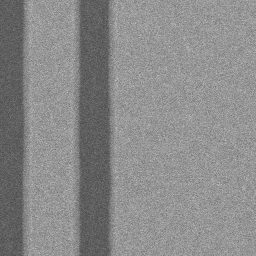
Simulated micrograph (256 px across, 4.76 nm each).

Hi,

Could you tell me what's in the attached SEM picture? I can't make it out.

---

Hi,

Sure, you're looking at one or a few lines or trenches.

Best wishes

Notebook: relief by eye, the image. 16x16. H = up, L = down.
LLHHHLLHHHHHHHHH
LLHHHLLHHHHHHHHH
LLHHHLLHHHHHHHHH
LLHHHLLHHHHHHHHH
LLHHHLLHHHHHHHHH
LLHHHLLHHHHHHHHH
LLHHHLLHHHHHHHHH
LLHHHLLHHHHHHHHH
LLHHHLLHHHHHHHHH
LLHHHLLHHHHHHHHH
LLHHHLLHHHHHHHHH
LLHHHLLHHHHHHHHH
LLHHHLLHHHHHHHHH
LLHHHLLHHHHHHHHH
LLHHHLLHHHHHHHHH
LLHHHLLHHHHHHHHH